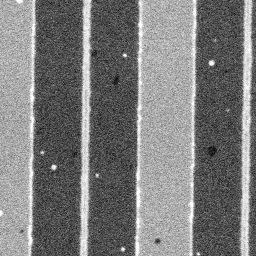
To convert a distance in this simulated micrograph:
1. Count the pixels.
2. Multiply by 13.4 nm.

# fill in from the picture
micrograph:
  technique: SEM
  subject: lines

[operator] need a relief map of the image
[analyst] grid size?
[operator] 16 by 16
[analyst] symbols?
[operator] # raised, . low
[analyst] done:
##.......###....
##.......###....
##.......###....
##.......###....
##.......###....
##.......###....
##.......###....
##.......###....
##.......###....
##.......###....
##.......###....
##.......###....
##.......###....
##.......###....
##.......###....
##.......###....